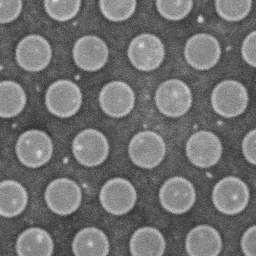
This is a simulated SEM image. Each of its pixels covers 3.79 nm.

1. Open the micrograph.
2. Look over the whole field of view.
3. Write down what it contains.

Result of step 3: a regular array of raised bodies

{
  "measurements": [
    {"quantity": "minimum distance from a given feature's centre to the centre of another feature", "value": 207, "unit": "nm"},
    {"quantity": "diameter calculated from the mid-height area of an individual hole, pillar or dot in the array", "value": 133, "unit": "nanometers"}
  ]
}